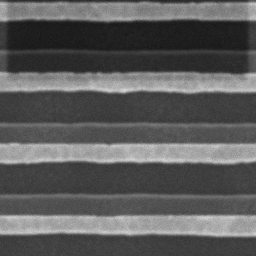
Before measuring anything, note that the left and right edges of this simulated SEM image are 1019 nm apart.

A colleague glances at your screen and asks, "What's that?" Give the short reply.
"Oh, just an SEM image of lines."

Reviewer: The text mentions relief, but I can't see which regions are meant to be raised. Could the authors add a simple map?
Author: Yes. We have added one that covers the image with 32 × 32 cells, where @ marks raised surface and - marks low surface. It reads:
@@@@@@@@@@@@@@@@@@@@@@@@@@@@@@@@
@@@@@@@@@@@@@@@@@@@@@@@@@@@@@@@@
@@---------@@@@@@-@@------------
--------------------------------
--------------------------------
--------------------------------
@@@@@@@@@@@@@@@@@@@@@@@@@@@@@@@@
@@@@@@@@@@@@@@@@@@@@@@@@@@@@@@@@
@@@@@@@@@@@@@@@@@@@@@@@@@@@@@@@@
@@@@@@@@@@@@@@@@@@@@@@@@@@@@@@@@
@@@@@@@@@@@@@@@@@@@@@@@@@@@@@@@@
--------------------------------
--------------------------------
--------------------------------
--------------------------------
@--------@@@@---@@@-------------
@@@@@@@@@@@@@@@@@@@@@@@@@@@@@@@@
@@@@@@@@@@@@@@@@@@@@@@@@@@@@@@@@
@@@@@@@@@@@@@@@@@@@@@@@@@@@@@@@@
@@@@@@@@@@@@@@@@@@@@@@@@@@@@@@@@
--------------------------------
--------------------------------
--------------------------------
--------------------------------
-@@@@@@@@@@@@@@@@@@@@----------@
@@@@@@@@@@@@@@@@@@@@@@@@@@@@@@@@
@@@@@@@@@@@@@@@@@@@@@@@@@@@@@@@@
@@@@@@@@@@@@@@@@@@@@@@@@@@@@@@@@
@@@@@@@@@@@@@@@@@@@@@@@@@@@@@@@@
--------------------------------
--------------------------------
--------------------------------